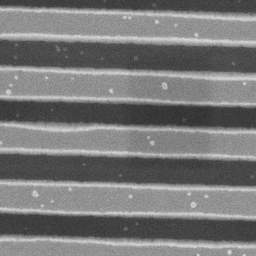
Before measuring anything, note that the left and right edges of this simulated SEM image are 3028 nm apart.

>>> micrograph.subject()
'lines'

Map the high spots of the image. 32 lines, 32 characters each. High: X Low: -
--------------------------------
XXXXXXXXXXXXXXXXX---------------
XXXXXXXXXXXXXXXXXXXXXXXXXXXXXXXX
XXXXXXXXXXXXXXXXXXXXXXXXXXXXXXXX
XXXXXXXXXXXXXXXXXXXXXXXXXXXXXXXX
----------------------------XXXX
--------------------------------
--------------------------------
XXX-----------------------------
XXXXXXXXXXXXXXXXXXXXXXXXXXXXXX--
XXXXXXXXXXXXXXXXXXXXXXXXXXXXXXXX
XXXXXXXXXXXXXXXXXXXXXXXXXXXXXXXX
---------XXXXXXXXXXXXXXXXXXXXXXX
--------------------------------
--------------------------------
XXXX----------------------------
XXXXXXXXXXXXXXXXXXXXXXXXXXXXXXXX
XXXXXXXXXXXXXXXXXXXXXXXXXXXXXXXX
XXXXXXXXXXXXXXXXXXXXXXXXXXXXXXXX
--------------------XXXXXXXXXXXX
--------------------------------
--------------------------------
--------------------------------
XXXXXXXXXXXXXXXXXXXXXXXXXXXXXX--
XXXXXXXXXXXXXXXXXXXXXXXXXXXXXXXX
XXXXXXXXXXXXXXXXXXXXXXXXXXXXXXXX
---XXXXXXXXXXXXXXXXXXXXXXXXXXXXX
--------------------------------
--------------------------------
--------------------------------
XXXXXXXXXXXXXXXXXXXXXXXXXXXXXX--
XXXXXXXXXXXXXXXXXXXXXXXXXXXXXXXX